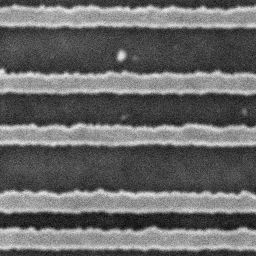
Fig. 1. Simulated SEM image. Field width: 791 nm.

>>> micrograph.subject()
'lines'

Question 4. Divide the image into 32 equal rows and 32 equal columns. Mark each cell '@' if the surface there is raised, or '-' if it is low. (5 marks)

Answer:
--------------------------------
@@@@@@@@@@@@@@@@@@@@@@@@@@@@@@@@
@@@@@@@@@@@@@@@@@@@@@@@@@@@@@@@@
--------------------------------
--------------------------------
--------------------------------
--------------------------------
--------------------------------
--------------------------------
@@@@@@@@@@@@@@@@@@@@@@@@@@@@@@@@
@@@@@@@@@@@@@@@@@@@@@@@@@@@@@@@@
@-@@@@@@@@@@@-@@@@@@@@@@@@-@@@@@
--------------------------------
--------------------------------
--------------------------------
--------------------------------
@@@@@@@@@@@@@@@@@@@@@@@@@@@@@@@@
@@@@@@@@@@@@@@@@@@@@@@@@@@@@@@@@
--------------------------------
--------------------------------
--------------------------------
--------------------------------
--------------------------------
--------------------------------
@@@@@@@@@@@@@@@@@@@@@@@@@@@@@@@@
@@@@@@@@@@@@@@@@@@@@@@@@@@@@@@@@
---------@-------@@-------@-@---
--------------------------------
--------------------------------
@@@@@@@@@@@@@@@@@@@@@@@@@@@@@@@@
@@@@@@@@@@@@@@@@@@@@@@@@@@@@@@@@
--------------------------------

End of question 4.